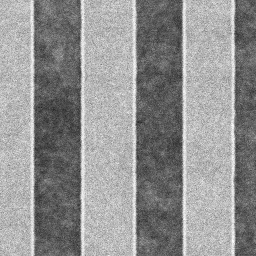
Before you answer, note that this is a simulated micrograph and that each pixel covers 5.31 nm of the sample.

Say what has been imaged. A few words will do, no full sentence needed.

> one or a few lines or trenches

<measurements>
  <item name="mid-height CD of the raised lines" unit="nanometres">264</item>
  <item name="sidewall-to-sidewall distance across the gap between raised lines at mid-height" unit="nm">267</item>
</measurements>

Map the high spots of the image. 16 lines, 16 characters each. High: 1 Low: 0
1100011100001110
1100011100001110
1100011100001110
1100011100001110
1100011100001110
1100011100001110
1100011100001110
1100011100001110
1100011100001110
1100011100001110
1100011100001110
1100011100001110
1100011100001110
1100011100001110
1100011100001110
1100011100001110